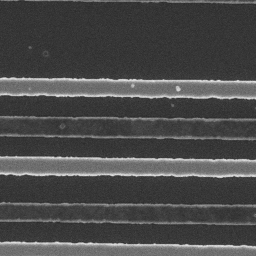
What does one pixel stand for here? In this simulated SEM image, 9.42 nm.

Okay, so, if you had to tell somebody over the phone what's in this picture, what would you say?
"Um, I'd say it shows lines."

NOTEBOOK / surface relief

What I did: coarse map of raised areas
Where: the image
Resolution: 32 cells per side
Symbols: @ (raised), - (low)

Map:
--------------------------------
--------------------------------
--------------------------------
--------------------------------
--------------------------------
--------------------------------
--------------------------------
--------------------------------
--------------------------------
--------------------------------
@@@@@@@@@@@@@@@@@@@@@@@@@@@@@@@@
@@@@@@@@@@@@@@@@@@@@@@@@@@@@@@@@
--------------------------------
--------------------------------
--------------------------------
@@@@@@@@@@@@@@@@@@@@@@@@@@@@@@@@
@@@@@@@@@@@@@@@@@@@@@@@@@@@@@@@@
--------------------------------
--------------------------------
--------------------------------
@@@@@@@@@@@@@@@@@@@@@@@@@@@@@@@@
@@@@@@@@@@@@@@@@@@@@@@@@@@@@@@@@
--------------------------------
--------------------------------
--------------------------------
@@@@@@--@-----------------------
@@@@@@@@@@@@@@@@@@@@@@@@@@@@@@@@
@@@@@@@@@@@@@@@@@@@@@@@@@@@@@@@@
--------------------------------
--------------------------------
@@@@@@@@@@@@@@@@---@------------
@@@@@@@@@@@@@@@@@@@@@@@@@@@@@@@@